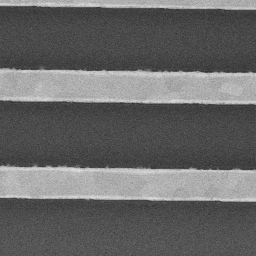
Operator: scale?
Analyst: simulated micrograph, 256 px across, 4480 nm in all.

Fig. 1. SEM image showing lines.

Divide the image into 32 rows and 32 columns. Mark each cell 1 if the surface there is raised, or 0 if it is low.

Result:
11111111111111111111111111111111
00000000000000000000000000000000
00000000000000000000000000000000
00000000000000000000000000000000
00000000000000000000000000000000
00000000000000000000000000000000
00000000000000000000000000000000
00000000000000000000000000000000
00000000000000000000000000000000
11111111111111111111111111111111
11111111111111111111111111111111
11111111111111111111111111111111
00000111111111111111111111111111
00000000000000000000000000000000
00000000000000000000000000000000
00000000000000000000000000000000
00000000000000000000000000000000
00000000000000000000000000000000
00000000000000000000000000000000
00000000000000000000000000000000
00000000000000000000000000000000
11111111111111111111111111111111
11111111111111111111111111111111
11111111111111111111111111111111
11111111111111111111111111111111
00000000000000000000000000000000
00000000000000000000000000000000
00000000000000000000000000000000
00000000000000000000000000000000
00000000000000000000000000000000
00000000000000000000000000000000
00000000000000000000000000000000